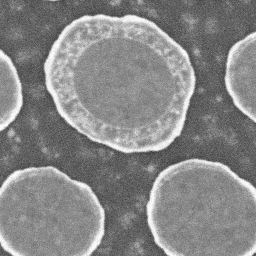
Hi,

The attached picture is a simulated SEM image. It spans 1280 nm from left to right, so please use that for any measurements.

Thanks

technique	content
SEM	raised bodies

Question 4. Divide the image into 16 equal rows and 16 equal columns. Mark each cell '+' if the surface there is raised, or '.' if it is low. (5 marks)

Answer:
................
.....+++++......
....+++++++....+
...+++++++++..++
+..+++++++++..++
+..+++++++++..++
+...++++++++...+
+...+++++++.....
.....++++++.....
................
..+........+++..
+++++.....+++++.
++++++...+++++++
++++++...+++++++
++++++....++++++
++++++....++++++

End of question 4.